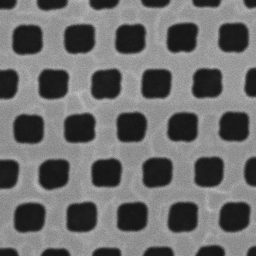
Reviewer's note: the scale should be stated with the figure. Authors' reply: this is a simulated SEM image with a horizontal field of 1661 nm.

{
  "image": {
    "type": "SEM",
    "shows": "a regular array of holes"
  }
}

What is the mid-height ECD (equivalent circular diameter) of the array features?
210 nm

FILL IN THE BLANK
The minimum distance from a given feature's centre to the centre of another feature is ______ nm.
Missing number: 331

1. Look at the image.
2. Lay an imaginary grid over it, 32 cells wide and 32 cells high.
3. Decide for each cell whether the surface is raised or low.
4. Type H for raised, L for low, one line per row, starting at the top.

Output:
LLHHHLLLHHHLLLLHHHLLLHHHLLLHHHHL
HHHHHHHHHHHHHHHHHHHHHHHHHHHHHHHH
HHHHHHHHHHHHHHHHHHHHHHHHHHHHHHHH
HHLLLHHHLLLLHHHLLLHHHLLLLHHLLLLH
HHLLLHHHLLLLHHLLLLHHHLLLLHHLLLLH
HHLLLHHHLLLLHHLLLLHHHLLLLHHLLLLH
HHLLLHHHHLLHHHHLLHHHHLHHHHHHLLHH
HHHHHHHHHHHHHHHHHHHHHHHHHHHHHHHH
HHHHHHHHHHHHHHHHHHHHHHHHHLHHHHHL
LLHHHLLLLHHHLLLHHHLLLHHHLLLLHHHL
LLHHHLLLLHHLLLLHHHLLLHHHLLLLHHHL
LLHHHLLLHHHLLLLHHHLLLHHHLLLLHHHL
HHHHHHLHHHHHHHHHHHHHHHHHHHHHHHHH
HHHHHHHHHHHHHHHHHHHHHHHHHHHHHHHH
HHLLLHHHHLLLHHHLLLHHHLLLLHHHLLLH
HHLLLHHHLLLLHHHLLLHHHLLLLHHLLLLH
HHLLLHHHLLLLHHHLLLHHHLLLLHHLLLLH
HHLLLHHHLLLLHHHLLLHHHLLLHHHHLLHH
HHHHHHHHHHHHHHHHHHHHHHHHHHHHHHHH
HHHHHHHHHHHHHHHHHHHHHHHHHHHHHHHH
LLHHHLLLLHHHLLLHHHLLLLHHLLLLHHHL
LLHHHLLLLHHLLLLHHHLLLLHHLLLLHHHL
LLHHHLLLLHHLLLLHHHLLLHHHLLLLHHHL
LHHHHHLHHHHHHHHHHHHHHHHHHHHHHHHH
HHHHHHHHHHHHHHHHHHHHHHHHHHHHHHHH
HHHLLHHHHLLLHHHLLLHHHHLLHHHHLLLH
HHLLLLHHLLLLHHHLLLHHHLLLLHHLLLLH
HHLLLLHHLLLLHHHLLLHHHLLLLHHLLLLH
HHLLLHHHLLLLHHHLLLHHHLLLHHHHLLLH
HHHHHHHHHHHHHHHHHHHHHHHHHHHHHHHH
HHHHHHHHHHHHHHHHHHHHHHHHHHHHHHHH
LLHHHLLLLHHHLLLHHHLLLLHHHLLLHHHL